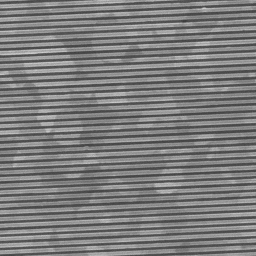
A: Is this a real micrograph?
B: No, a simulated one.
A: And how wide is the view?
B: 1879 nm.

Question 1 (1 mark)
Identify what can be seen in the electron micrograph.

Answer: parallel lines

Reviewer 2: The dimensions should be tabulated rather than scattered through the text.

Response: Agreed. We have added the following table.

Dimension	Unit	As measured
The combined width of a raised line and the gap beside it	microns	0.0488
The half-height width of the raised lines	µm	0.0229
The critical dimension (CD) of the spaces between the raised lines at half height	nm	22.9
